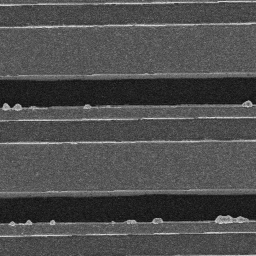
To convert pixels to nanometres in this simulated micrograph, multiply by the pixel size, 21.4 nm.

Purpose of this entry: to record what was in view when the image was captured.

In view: lines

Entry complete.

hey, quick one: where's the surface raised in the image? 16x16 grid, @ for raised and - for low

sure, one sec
@@@@@@@@@@@@@@@@
@@@@@@@@@@@@@@@@
@@@@@@@@@@@@@@@@
@@@@@@@@@@@@@@@@
@@@@@@@@@@@@@@@@
----------------
---------------@
@@@@@@@@@@@@@@@@
@@@@@@@@@@@@@@@@
@@@@@@@@@@@@@@@@
@@@@@@@@@@@@@@@@
@@@@@@@@@@@@@@@@
----------------
----------------
@@@@@@@@@@@@@@@@
@@@@@@@@@@@@@@@@